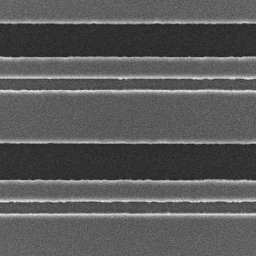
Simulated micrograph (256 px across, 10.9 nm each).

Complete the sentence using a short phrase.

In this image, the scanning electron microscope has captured lines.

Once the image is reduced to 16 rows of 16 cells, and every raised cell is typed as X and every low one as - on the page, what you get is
XXXXXXXXXXXXXXXX
----------------
----------------
----------------
XXXXXXXXXXXXXXXX
XXXXXXXXXXXXXXXX
XXXXXXXXXXXXXXXX
XXXXXXXXXXXXXXXX
XXXXXXXXXXXXXXXX
----------------
----------------
XXXXXXXXXXXXXXXX
XXXXXXXXXXXXXXXX
XXXXXXXXXXXXXXXX
XXXXXXXXXXXXXXXX
XXXXXXXXXXXXXXXX